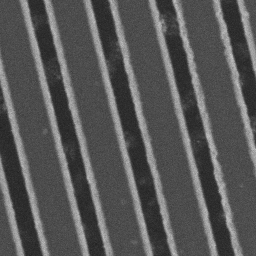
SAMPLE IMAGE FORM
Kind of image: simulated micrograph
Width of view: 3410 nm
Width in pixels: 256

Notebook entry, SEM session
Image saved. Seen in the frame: one or a few lines or trenches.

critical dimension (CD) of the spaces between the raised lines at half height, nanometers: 516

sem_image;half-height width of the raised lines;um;0.318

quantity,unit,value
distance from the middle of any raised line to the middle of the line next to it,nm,832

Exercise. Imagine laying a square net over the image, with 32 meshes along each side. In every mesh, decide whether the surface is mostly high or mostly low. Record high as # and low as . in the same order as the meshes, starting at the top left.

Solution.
...###.....###.....###.....###..
...###.....###.....###.....###..
....##.....####.....###.....###.
....###.....###.....###.....###.
....###.....###.....###.....###.
....###.....###.....###.....###.
.....##.....####.....###.....###
.....###.....###.....###.....###
.....###.....###.....###.....###
.....###.....###.....###.....###
#....###......###.....###.....##
#.....###.....###.....###.....##
#.....###.....###.....###.....##
#.....###.....###.....###.....##
##....###.....####.....###.....#
##.....###.....###.....###.....#
##.....###.....###.....###.....#
##.....###.....###.....###.....#
##.....###.....####.....###.....
###.....###.....###.....###.....
###.....###.....###.....###.....
###.....###.....###.....###.....
###.....###.....####.....##.....
.###.....###.....###.....###....
.###.....###.....###.....###....
.###.....###.....###.....###....
.###.....###.....###......###...
..###.....###.....###.....###...
..###.....###.....###.....###...
..###.....###.....###.....###...
..###.....###.....###.....###...
...###.....###.....###.....###..